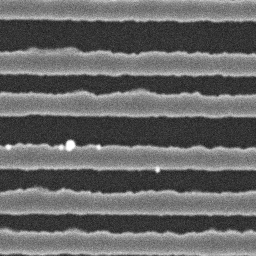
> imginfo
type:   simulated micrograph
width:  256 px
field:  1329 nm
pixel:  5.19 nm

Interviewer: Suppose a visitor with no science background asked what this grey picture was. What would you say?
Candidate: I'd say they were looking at lines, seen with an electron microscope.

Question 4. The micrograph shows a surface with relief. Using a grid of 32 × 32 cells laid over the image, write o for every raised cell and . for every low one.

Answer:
oooooooooooooooooooooooooooooooo
oooooooooooooooooooooooooooooooo
.........ooooooooooooooooooooooo
................................
................................
................................
.ooooooooo.ooo.....o..o.........
oooooooooooooooooooooooooooooooo
oooooooooooooooooooooooooooooooo
.............................o..
................................
..........o.....ooo.............
oooooooooooooooooooooooooooooooo
oooooooooooooooooooooooooooooooo
.........o....o.oooo.ooooooooooo
................................
................................
................................
ooooooooooooooooooooooo.oo.o.o.o
oooooooooooooooooooooooooooooooo
oooooooooooooooooooooooooooooooo
................................
................................
....o...........................
oooooooooooooooooooooooooooooooo
oooooooooooooooooooooooooooooooo
oooooooooooooooooooooooooooooooo
................................
................................
oooooooooooooooooooooooooooooooo
oooooooooooooooooooooooooooooooo
oooooooooooooooooooooooooooooooo